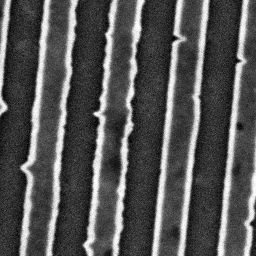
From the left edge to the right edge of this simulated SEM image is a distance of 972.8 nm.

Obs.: one or a few lines or trenches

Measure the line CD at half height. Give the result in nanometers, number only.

100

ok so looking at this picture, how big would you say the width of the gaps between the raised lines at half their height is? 38.7 pixels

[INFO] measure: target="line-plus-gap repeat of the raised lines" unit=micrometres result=0.25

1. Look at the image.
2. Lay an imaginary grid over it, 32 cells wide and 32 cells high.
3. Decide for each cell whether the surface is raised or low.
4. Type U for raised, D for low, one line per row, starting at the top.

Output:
UDDDDDUUUDDDDDUUUDDDDDUUUUDDDDDU
UDDDDDUUUDDDDDUUUDDDDDUUUUDDDDDU
UDDDDDUUUDDDDDUUUDDDDDUUUUDDDDDU
UDDDDDUUUDDDDDUUUDDDDDUUUDDDDDUU
UDDDDDUUUDDDDDUUUDDDDDUUUDDDDDUU
DDDDDUUUUDDDDDUUUDDDDDUUUDDDDDUU
DDDDDUUUUDDDDDUUUDDDDDUUUDDDDDUU
DDDDDUUUUDDDDDUUUDDDDDUUUDDDDDUU
DDDDDUUUUDDDDUUUUDDDDDUUUDDDDDUU
DDDDDUUUUDDDDUUUUDDDDDUUUDDDDDUU
DDDDDUUUDDDDDUUUUDDDDUUUUDDDDDUU
DDDDDUUUDDDDDUUUDDDDDUUUUDDDDDUU
DDDDDUUUDDDDDUUUDDDDDUUUUDDDDUUU
DDDDUUUUDDDDDUUUDDDDDUUUUDDDDUUU
DDDDUUUUDDDDUUUUDDDDDUUUUDDDDUUU
DDDDUUUUDDDDDUUUDDDDDUUUUDDDDUUU
DDDDUUUUDDDDDUUUDDDDDUUUDDDDDUUU
DDDDUUUUDDDDDUUUDDDDDUUUDDDDDUUU
DDDDUUUDDDDDUUUUDDDDDUUUDDDDDUUU
DDDDUUUDDDDDUUUUDDDDDUUUDDDDDUUU
DDDUUUUDDDDDUUUUDDDDUUUUDDDDDUUU
DDDUUUUDDDDDUUUUDDDDUUUUDDDDDUUU
DDDDUUUDDDDDUUUDDDDDUUUUDDDDUUUU
DDDDUUUDDDDDUUUDDDDDUUUDDDDDUUUU
DDDUUUUDDDDDUUUDDDDDUUUDDDDDUUUU
DDDUUUUDDDDDUUUDDDDDUUUDDDDDUUUD
DDDUUUUDDDDDUUUDDDDDUUUDDDDDUUUD
DDDUUUUDDDDUUUUDDDDDUUUDDDDDUUUD
DDDUUUDDDDDUUUUDDDDDUUUDDDDDUUUD
DDDUUUDDDDDUUUUDDDDDUUUDDDDDUUUD
DDDUUUDDDDDUUUDDDDDUUUUDDDDDUUUD
DDDUUUDDDDDUUUDDDDDUUUUDDDDDUUUD